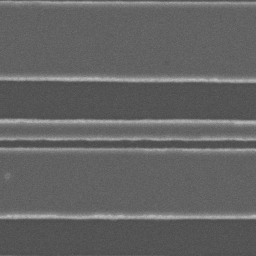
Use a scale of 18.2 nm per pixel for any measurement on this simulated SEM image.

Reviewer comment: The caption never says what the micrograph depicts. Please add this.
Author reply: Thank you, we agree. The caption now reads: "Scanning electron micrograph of lines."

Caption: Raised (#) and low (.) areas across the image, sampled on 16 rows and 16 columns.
################
################
################
################
################
................
................
................
################
################
################
################
################
################
................
................